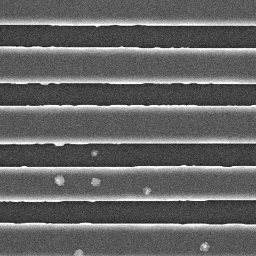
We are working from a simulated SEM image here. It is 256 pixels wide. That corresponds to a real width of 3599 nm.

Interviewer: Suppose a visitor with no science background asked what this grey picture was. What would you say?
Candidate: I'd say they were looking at lines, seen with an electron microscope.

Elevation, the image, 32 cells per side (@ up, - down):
@@@@@@@@@@@@@@@@@@@@@@@@@@@@@@@@
@@@@@@@@@@@@@@@@@@@@@@@@@@@@@@@@
@@@@@@@@@@@@@@@@@@@@@@@@@@@@@@@@
--------------------------------
--------------------------------
--------------------------------
@@@@@@@@@@@@@@@@@@@@@@@@@@@@@@@@
@@@@@@@@@@@@@@@@@@@@@@@@@@@@@@@@
@@@@@@@@@@@@@@@@@@@@@@@@@@@@@@@@
@@@@@@@@@@@@@@@@@@@@@@@@@@@@@@@@
--------------------------------
--------------------------------
--------------------------------
@@@@@@@@@@@@@@@@@@@@@@@@@@@@@@@@
@@@@@@@@@@@@@@@@@@@@@@@@@@@@@@@@
@@@@@@@@@@@@@@@@@@@@@@@@@@@@@@@@
@@@@@@@@@@@@@@@@@@@@@@@@@@@@@@@@
@@@@@@@@@@@@@@@@@@@@@@@@@@@@@@@@
--------------------------------
--------------------------------
--------------------------------
@@@@@@@@@@@@@@@@@@@@@@@@@@@@@@@@
@@@@@@@@@@@@@@@@@@@@@@@@@@@@@@@@
@@@@@@@@@@@@@@@@@@@@@@@@@@@@@@@@
@@@@@@@@@@@@@@@@@@@@@@@@@@@@@@@@
--------------------------------
--------------------------------
--------------------------------
@@@@@@@@@@@@@@@@@@@@@@@@@@@@@@@@
@@@@@@@@@@@@@@@@@@@@@@@@@@@@@@@@
@@@@@@@@@@@@@@@@@@@@@@@@@@@@@@@@
@@@@@@@@@@@@@@@@@@@@@@@@@@@@@@@@